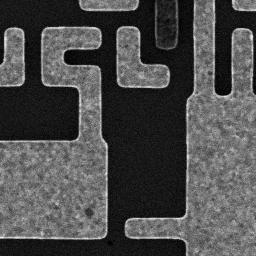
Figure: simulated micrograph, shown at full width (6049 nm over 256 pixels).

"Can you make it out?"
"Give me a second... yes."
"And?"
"wiring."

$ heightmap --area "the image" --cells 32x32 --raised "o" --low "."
..........ooooooo...oo..ooo..ooo
....................oo..ooo.....
....................oo..ooo.....
.......ooooo...oo...oo..ooo.....
.oo..oooooooo..oo...oo..ooo..ooo
.oo..oooooooo..oo...oo..ooo..ooo
.oo..ooo.......oo.......ooo..ooo
ooo..ooo.......ooo......ooo..ooo
ooo..ooooooo...oooooo...ooo..ooo
ooo..oooooooo..oooooo...ooo..ooo
ooo...ooooooo..oooooo...ooo..oo.
..........ooo...........ooo..ooo
..........ooo..........ooooooooo
..........ooo..........ooooooooo
..........ooo..........ooooooooo
..........ooo..........ooooooooo
..........ooo..........ooooooooo
.........oooo..........ooooooooo
ooooooooooooo..........ooooooooo
ooooooooooooo..........ooooooooo
ooooooooooooo..........ooooooooo
ooooooooooooo..........ooooooooo
ooooooooooooo..........ooooooooo
ooooooooooooo..........ooooooooo
ooooooooooooo..........ooooooooo
ooooooooooooo..........ooooooooo
ooooooooooooo..........ooooooooo
ooooooooooooo...oooooooooooooooo
ooooooooooooo...oooooooooooooooo
ooooooooooooo...oooooooooooooooo
.......................ooooooooo
.......................ooooooooo